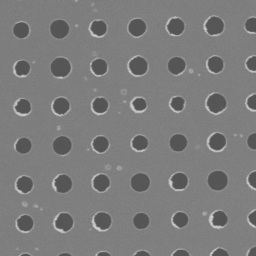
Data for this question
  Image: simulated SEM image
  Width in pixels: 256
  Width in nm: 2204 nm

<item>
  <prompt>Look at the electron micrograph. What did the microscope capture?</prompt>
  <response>a regular array of holes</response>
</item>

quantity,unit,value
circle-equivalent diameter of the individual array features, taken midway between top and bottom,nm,143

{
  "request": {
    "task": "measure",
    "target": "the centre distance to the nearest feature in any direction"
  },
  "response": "38.4 pixels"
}